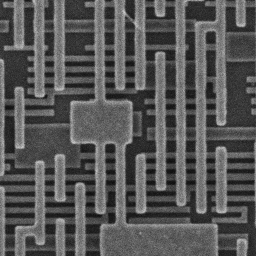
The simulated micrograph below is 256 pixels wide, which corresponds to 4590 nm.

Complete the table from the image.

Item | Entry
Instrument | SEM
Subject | wiring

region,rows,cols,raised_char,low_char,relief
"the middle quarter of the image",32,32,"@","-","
--------@@---@@---@@---@@---@@--
--------@@---@@---@@---@@---@@--
--------@@---@@---@@---@@---@@--
--------@@---@@---@@---@@---@@--
--------@@---@@---@@---@@---@@--
--------@@---@@---@@---@@---@@--
--------@@-------------@@---@@--
--------@@-------------@@---@@--
--------@@-------------@@---@@--
--@@@@@@@@@@@@@@@------@@---@@--
--@@@@@@@@@@@@@@@------@@---@@--
--@@@@@@@@@@@@@@@------@@---@@--
--@@@@@@@@@@@@@@@------@@---@@--
--@@@@@@@@@@@@@@@------@@---@@--
--@@@@@@@@@@@@@@@------@@---@@--
--@@@@@@@@@@@@@@@------@@---@@--
--@@@@@@@@@@@@@@@------@@---@@--
--@@@@@@@@@@@@@@@------@@---@@--
--@@@@@@@@@@@@@@@------@@---@@--
--@@@@@@@@@@@@@@@------@@---@@--
--------@@---@@--------@@---@@--
--------@@---@@--------@@---@@--
--------@@---@@--------@@---@@--
--------@@---@@---@@---@@---@@--
--------@@---@@---@@---@@---@@--
--------@@---@@---@@---@@---@@--
--------@@---@@---@@---@@---@@--
--------@@---@@---@@---@@---@@--
--------@@---@@---@@---@@---@@--
--------@@---@@---@@---@@---@@--
---@@---@@---@@---@@---@@---@@--
---@@---@@---@@---@@--------@@--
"